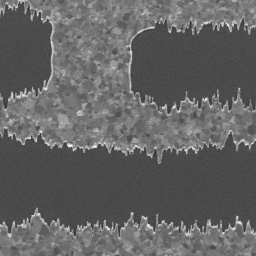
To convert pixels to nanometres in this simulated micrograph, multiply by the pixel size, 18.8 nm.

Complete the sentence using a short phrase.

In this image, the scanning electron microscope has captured one or a few lines or trenches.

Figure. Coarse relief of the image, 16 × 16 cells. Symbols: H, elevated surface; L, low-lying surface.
HLHHHHHHHHHHHHHH
LLLHHHHHHHHHHHHH
LLLHHHHHLLLLLLLL
LLLHHHHHLLLLLLLL
LLLHHHHHLLLLLLLL
LLLHHHHHLLLLLLLL
HHHHHHHHHHLHHHHL
HHHHHHHHHHHHHHHH
LHHHHHHHHHHHHHHH
LLLLLLLLLHLLLLLL
LLLLLLLLLLLLLLLL
LLLLLLLLLLLLLLLL
LLLLLLLLLLLLLLLL
LLLLLLLLLLLLLLLL
HHHHHHHHHHHHHHHH
HHHHHHHHHHHHHHHH